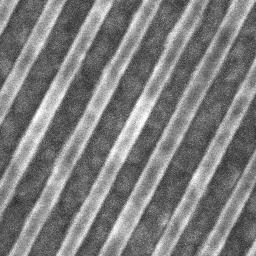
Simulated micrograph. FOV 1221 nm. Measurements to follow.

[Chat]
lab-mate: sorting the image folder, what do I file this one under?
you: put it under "parallel lines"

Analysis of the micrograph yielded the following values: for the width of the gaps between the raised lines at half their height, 127 nanometers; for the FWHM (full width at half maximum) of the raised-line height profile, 76 nm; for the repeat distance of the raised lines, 199 nm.